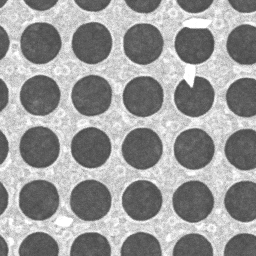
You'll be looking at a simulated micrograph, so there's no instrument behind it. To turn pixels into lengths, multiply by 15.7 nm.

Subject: a regular array of holes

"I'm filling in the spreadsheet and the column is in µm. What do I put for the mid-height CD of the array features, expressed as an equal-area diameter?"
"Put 0.655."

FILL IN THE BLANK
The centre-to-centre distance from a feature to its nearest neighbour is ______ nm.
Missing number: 804